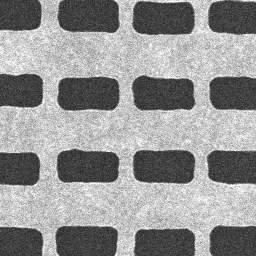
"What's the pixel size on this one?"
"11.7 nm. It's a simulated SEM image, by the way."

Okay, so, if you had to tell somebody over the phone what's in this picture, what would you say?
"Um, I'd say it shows holes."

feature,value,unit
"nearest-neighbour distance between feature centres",852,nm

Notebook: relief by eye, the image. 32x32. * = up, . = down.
.....**........**.......***.....
.....**........**.......**......
.....**........**.......**......
.....***.......**.......**......
********************************
********************************
********************************
********************************
********************************
.....***************************
.....**........*........**......
.....**........**.......**......
.....**........**.......**......
********......***.......***.....
********************************
********************************
********************************
********************************
********************************
.....**........**.......**......
.....**........**.......**......
.....**........**.......**......
.....***......***.......**......
********************************
********************************
********************************
********************************
********************************
....***.......*************.....
.....**........**.......**......
.....**........**.......**......
.....**........**.......**......